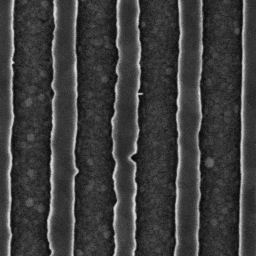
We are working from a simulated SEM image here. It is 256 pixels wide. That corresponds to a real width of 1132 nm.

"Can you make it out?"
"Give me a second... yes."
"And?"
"one or a few lines or trenches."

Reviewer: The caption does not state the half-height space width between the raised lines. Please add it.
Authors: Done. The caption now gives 182 nm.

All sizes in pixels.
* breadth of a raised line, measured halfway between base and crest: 22.4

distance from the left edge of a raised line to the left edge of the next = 277 nm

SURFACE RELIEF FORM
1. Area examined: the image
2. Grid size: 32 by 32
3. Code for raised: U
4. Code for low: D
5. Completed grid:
UUDDDDDUUUDDDDDUUDDDDDUUUDDDDDUU
UUDDDDDUUUDDDDDUUDDDDDUUUDDDDDDU
UUDDDDDUUDDDDDDUUDDDDDUUUDDDDDDU
UUDDDDDUUDDDDDDUUDDDDDDUUDDDDDUU
UUDDDDDUUDDDDDDUUDDDDDDUUDDDDDUU
UUDDDDDUUDDDDDDUUDDDDDUUUDDDDDUU
UUDDDDDUUDDDDDDUUUDDDDDUUDDDDDUU
UUDDDDDUUDDDDDDUUDDDDDUUUDDDDDUU
UUDDDDDUUDDDDDDUUUDDDDUUUDDDDDUU
UUDDDDDUUUDDDDDUUUDDDDUUUDDDDDUU
UDDDDDDUUUDDDDUUUDDDDDUUUDDDDDUU
UDDDDDDUUUDDDDUUUDDDDDUUUDDDDDUU
UDDDDDDUUUDDDDUUUDDDDDUUUDDDDDUU
UUDDDDDUUUDDDDUUUDDDDDUUUDDDDDUU
UUDDDDDUUUDDDDUUUDDDDDUUUDDDDDUU
UUDDDDDUUUDDDDUUUDDDDDUUUDDDDDUU
UDDDDDDUUUDDDDUUUDDDDDUUUDDDDDUU
UDDDDDUUUDDDDDUUUDDDDDUUUDDDDDUU
UDDDDDUUUDDDDDUUUDDDDDUUUDDDDDUU
UDDDDDDUUDDDDDUUUDDDDDUUUDDDDDUU
UDDDDDUUUDDDDDDUUDDDDDUUUDDDDDUU
UDDDDDUUUUDDDDUUUDDDDDUUUDDDDDUU
UDDDDDUUUDDDDDUUUDDDDDUUUDDDDDUU
UDDDDDUUUDDDDDUUUDDDDDUUUDDDDDUU
UDDDDDUUUDDDDDDUUDDDDDUUUDDDDDUU
UDDDDDUUUDDDDDDUUDDDDDUUUDDDDDUU
UDDDDDUUUDDDDDUUUDDDDDUUUDDDDDUU
UDDDDDUUUDDDDDUUUDDDDDUUUDDDDDUU
UDDDDDUUUDDDDDUUUDDDDDUUUDDDDDUU
UDDDDDUUUDDDDDUUUDDDDDUUUDDDDDUU
UDDDDDUUUDDDDDUUUDDDDDUUUDDDDDUU
UDDDDDUUUDDDDDUUUDDDDDUUUDDDDDUU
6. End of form